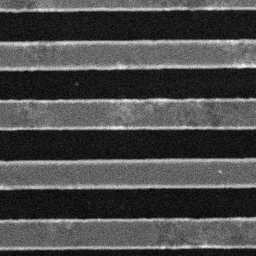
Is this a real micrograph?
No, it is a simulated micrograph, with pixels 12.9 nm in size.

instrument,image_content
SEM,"lines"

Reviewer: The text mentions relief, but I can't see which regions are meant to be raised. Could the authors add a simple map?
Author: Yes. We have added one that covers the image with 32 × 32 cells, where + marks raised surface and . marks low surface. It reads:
++++++++++++++++++++++++++++++++
................................
................................
................................
................................
++++++++++++++++++++++++++++++++
++++++++++++++++++++++++++++++++
++++++++++++++++++++++++++++++++
++++++++++++++++++++++++++++....
................................
................................
................................
.+.+...+++++++++++++++++++++++++
++++++++++++++++++++++++++++++++
++++++++++++++++++++++++++++++++
++++++++++++++++++++++++++++++++
................................
................................
................................
................................
++++++++++++++++++++++++++++++++
++++++++++++++++++++++++++++++++
++++++++++++++++++++++++++++++++
++++++++++++++++++..............
................................
................................
................................
..+...++++++++++++++++++++++++++
++++++++++++++++++++++++++++++++
++++++++++++++++++++++++++++++++
++++++++++++++++++++++++++++++++
................................